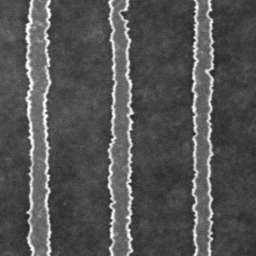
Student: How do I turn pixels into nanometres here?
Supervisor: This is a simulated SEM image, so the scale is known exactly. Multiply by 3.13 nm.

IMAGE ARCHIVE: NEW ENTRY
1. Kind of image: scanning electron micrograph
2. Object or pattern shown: one or a few lines or trenches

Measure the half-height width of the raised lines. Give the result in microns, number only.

0.0529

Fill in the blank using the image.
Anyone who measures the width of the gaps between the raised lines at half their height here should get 203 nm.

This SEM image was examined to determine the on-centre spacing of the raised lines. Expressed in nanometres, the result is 257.